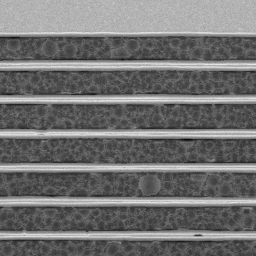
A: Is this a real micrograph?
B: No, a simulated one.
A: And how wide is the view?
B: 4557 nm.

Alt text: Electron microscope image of parallel lines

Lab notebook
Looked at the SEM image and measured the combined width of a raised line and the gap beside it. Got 0.606 um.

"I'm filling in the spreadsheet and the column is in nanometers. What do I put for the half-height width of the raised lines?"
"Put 114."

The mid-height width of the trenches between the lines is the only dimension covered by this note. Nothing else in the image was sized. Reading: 492 nanometers